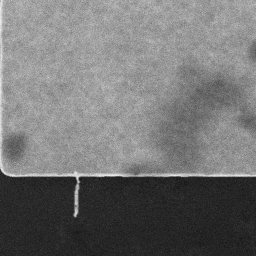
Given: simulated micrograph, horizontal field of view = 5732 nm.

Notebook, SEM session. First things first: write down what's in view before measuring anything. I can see wiring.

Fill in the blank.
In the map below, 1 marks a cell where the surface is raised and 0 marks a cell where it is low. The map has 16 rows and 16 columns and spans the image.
1111111111111111
1111111111111111
1111111111111111
1111111111111111
1111111111111111
1111111111111111
1111111111111111
1111111111111111
1111111111111111
1111111111111111
1111111111111111
0000000000000000
0000000000000000
0000000000000000
0000000000000000
0000000000000000